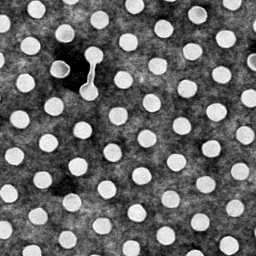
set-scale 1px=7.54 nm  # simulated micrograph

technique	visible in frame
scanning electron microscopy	a regular array of raised bodies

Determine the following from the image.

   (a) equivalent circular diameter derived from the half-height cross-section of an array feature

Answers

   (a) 136 nm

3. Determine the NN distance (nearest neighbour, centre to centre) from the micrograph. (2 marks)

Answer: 275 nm